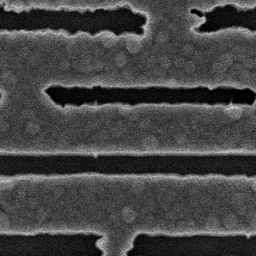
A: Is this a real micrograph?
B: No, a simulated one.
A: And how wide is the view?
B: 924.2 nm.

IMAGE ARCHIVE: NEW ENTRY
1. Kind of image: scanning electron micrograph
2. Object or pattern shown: one or a few lines or trenches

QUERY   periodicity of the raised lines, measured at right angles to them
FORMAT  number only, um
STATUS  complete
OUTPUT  0.264